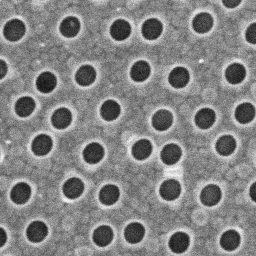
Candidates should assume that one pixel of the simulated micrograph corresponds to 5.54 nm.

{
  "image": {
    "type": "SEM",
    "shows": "a regular array of holes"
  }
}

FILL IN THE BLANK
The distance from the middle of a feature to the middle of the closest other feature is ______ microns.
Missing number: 0.202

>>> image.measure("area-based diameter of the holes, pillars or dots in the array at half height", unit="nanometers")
124